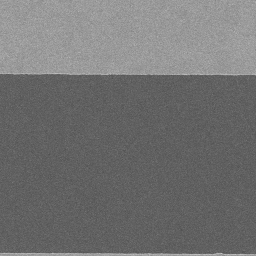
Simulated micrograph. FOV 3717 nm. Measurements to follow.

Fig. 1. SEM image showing one or a few lines or trenches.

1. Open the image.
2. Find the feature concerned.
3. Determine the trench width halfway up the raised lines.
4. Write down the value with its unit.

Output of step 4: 2.6 µm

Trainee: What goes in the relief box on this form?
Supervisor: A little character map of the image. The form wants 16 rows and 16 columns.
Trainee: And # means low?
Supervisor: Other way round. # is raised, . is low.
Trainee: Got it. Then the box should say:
################
################
################
################
################
................
................
................
................
................
................
................
................
................
................
................